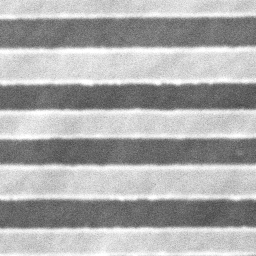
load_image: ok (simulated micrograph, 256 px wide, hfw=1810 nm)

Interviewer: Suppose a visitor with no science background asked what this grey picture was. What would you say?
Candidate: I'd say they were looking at lines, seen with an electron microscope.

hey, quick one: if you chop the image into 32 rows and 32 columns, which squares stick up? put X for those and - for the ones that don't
XXXXXXXXXXXXXXXXXXXXXXXXXXXXXXXX
XXXXXXXXXXXXXXXXXXXXXXXXXXXXXXXX
--------------------------------
--------------------------------
--------------------------------
--------------------------------
XXXXXXXXXXXXXXXXXXXXXXXXXXXXXXXX
XXXXXXXXXXXXXXXXXXXXXXXXXXXXXXXX
XXXXXXXXXXXXXXXXXXXXXXXXXXXXXXXX
XXXXXXXXXXXXXXXXXXXXXXXXXXXXXXXX
X---------XX-------X--X---------
--------------------------------
--------------------------------
--------------------------------
XXXXXXXXXXXXXXXXXXXXXXXXXXXXXXXX
XXXXXXXXXXXXXXXXXXXXXXXXXXXXXXXX
XXXXXXXXXXXXXXXXXXXXXXXXXXXXXXXX
--------------------------------
--------------------------------
--------------------------------
--------------------------------
XXXXXXXXXXXXXXXXXXXXXXXXXXXXXXXX
XXXXXXXXXXXXXXXXXXXXXXXXXXXXXXXX
XXXXXXXXXXXXXXXXXXXXXXXXXXXXXXXX
XXXXXXXXXXXXXXXXXXXXXXXXXXXXXXXX
--------------------------------
--------------------------------
--------------------------------
--------------------------------
XXXXXXXXXXXXXXXXXXXXXXXXXXXXXXXX
XXXXXXXXXXXXXXXXXXXXXXXXXXXXXXXX
XXXXXXXXXXXXXXXXXXXXXXXXXXXXXXXX